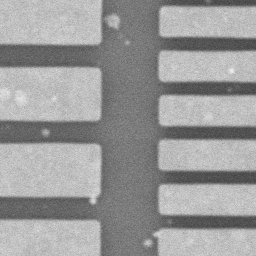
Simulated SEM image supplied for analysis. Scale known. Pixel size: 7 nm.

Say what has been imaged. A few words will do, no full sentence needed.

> groups of lines, slits or small figures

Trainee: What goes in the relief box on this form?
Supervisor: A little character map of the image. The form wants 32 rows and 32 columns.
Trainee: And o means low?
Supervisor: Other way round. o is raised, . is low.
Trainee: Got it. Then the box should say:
ooooooooooooo...................
ooooooooooooo.......oooooooooooo
ooooooooooooo.......oooooooooooo
ooooooooooooo.......oooooooooooo
ooooooooooooo.......oooooooooooo
................................
....................oooooooooooo
....................oooooooooooo
....................oooooooooooo
oooooooooooo........oooooooooooo
oooooooooooo....................
oooooooooooo....................
oooooooooooo........oooooooooooo
oooooooooooo........oooooooooooo
oooooooooooo........oooooooooooo
....................oooooooooooo
................................
................................
oooooooooooo........oooooooooooo
oooooooooooo........oooooooooooo
oooooooooooo........oooooooooooo
oooooooooooo....................
oooooooooooo....................
oooooooooooo........oooooooooooo
...oooo...oo........oooooooooooo
....................oooooooooooo
....................oooooooooooo
................................
oooooooooooo....................
oooooooooooo........oooooooooooo
oooooooooooo........oooooooooooo
oooooooooooo........oooooooooooo